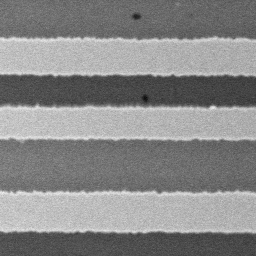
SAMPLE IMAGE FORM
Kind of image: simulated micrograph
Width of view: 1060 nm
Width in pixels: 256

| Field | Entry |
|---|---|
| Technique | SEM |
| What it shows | lines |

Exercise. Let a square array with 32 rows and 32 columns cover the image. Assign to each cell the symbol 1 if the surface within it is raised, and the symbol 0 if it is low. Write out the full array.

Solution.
00000000000000000000000000000000
00000000000000000000000000000000
00000000000000000000000000000000
00000000000000000000000000000000
00000000000000000000000000000000
11111111111111111111111111111111
11111111111111111111111111111111
11111111111111111111111111111111
11111111111111111111111111111111
00000000000000000000000000000000
00000000000000000000000000000000
00000000000000000000000000000000
00000000000000000000000000000000
11101000001101011100100100100100
11111111111111111111111111111111
11111111111111111111111111111111
11111111111111111111111111111111
00000000000000000000000000000000
00000000000000000000000000000000
00000000000000000000000000000000
00000000000000000000000000000000
00000000000000000000000000000000
00000000000000000000000000000000
00000000000000000000000000000000
11111111111111111111111111111111
11111111111111111111111111111111
11111111111111111111111111111111
11111111111111111111111111111111
11111111111111111111111111111111
00000000000000000000000000000000
00000000000000000000000000000000
00000000000000000000000000000000